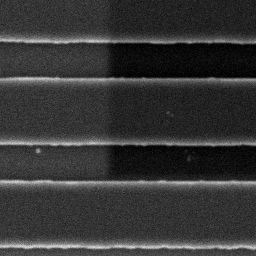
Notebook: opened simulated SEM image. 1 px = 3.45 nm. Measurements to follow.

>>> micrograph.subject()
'lines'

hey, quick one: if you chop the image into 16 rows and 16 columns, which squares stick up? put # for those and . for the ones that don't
################
################
################
................
................
################
################
################
################
................
................
################
################
################
################
............#.##